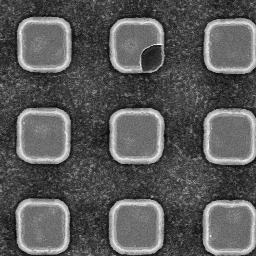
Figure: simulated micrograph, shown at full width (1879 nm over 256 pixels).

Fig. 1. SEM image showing raised bodies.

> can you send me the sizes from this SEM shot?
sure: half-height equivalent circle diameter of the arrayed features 0.407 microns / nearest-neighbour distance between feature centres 90.7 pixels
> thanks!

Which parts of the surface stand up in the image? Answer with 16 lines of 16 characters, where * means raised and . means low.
................
.***...***...***
.***...***...***
.***...**....***
................
................
................
.***...***...***
.***...***...***
.***...***...***
................
................
................
.***...***...***
.***...***...***
..**...***...***